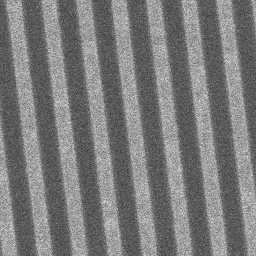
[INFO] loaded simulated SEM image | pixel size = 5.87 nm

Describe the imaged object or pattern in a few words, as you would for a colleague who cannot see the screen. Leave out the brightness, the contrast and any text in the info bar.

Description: parallel lines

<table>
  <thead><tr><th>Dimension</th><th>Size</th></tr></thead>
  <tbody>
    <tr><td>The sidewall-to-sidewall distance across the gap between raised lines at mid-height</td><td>103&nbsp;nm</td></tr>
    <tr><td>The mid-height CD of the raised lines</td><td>0.0976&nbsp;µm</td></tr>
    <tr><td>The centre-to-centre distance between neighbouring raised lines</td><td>204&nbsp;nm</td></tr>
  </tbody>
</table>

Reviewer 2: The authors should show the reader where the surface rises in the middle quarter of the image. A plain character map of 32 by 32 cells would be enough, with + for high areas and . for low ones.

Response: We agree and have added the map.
.....++++.....++++....+++++....+
.....++++.....++++.....++++....+
+....++++.....++++.....++++....+
+....++++.....++++.....++++....+
+....++++.....++++.....++++.....
+....++++.....++++.....++++.....
+.....++++....++++.....++++.....
+.....++++.....++++....++++.....
+.....++++.....++++....++++.....
+.....++++.....++++.....++++....
++....++++.....++++.....++++....
++....++++.....++++.....++++....
++....++++.....++++.....++++....
++....++++.....++++.....++++....
++.....++++....++++.....++++....
++.....++++.....++++....++++....
++.....++++.....++++....++++....
++.....++++.....++++.....++++...
+++....++++.....++++.....++++...
+++....++++.....++++.....++++...
+++....+++++....++++.....++++...
+++....+++++....++++.....++++...
+++.....++++....++++.....++++...
+++.....++++.....++++....++++...
+++.....++++.....++++....++++...
+++.....++++.....++++.....++++..
++++....++++.....++++.....++++..
++++....++++.....++++.....++++..
++++....+++++....++++.....++++..
++++....+++++....++++.....++++..
++++.....++++....++++.....++++..
++++.....++++....+++++....++++..